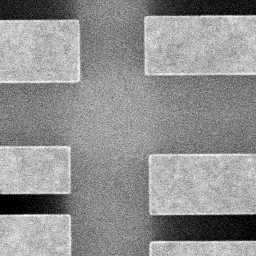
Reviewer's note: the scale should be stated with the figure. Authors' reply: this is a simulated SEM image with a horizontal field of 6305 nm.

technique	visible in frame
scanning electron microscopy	groups of lines, slits or small figures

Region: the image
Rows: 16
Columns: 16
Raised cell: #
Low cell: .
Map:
................
#####....#######
#####....#######
#####....#######
#####....#######
................
................
................
................
####............
####.....#######
####.....#######
.........#######
####............
####............
####.....#######